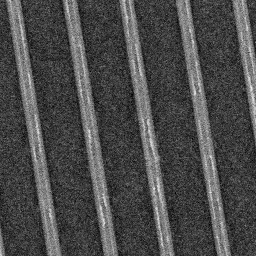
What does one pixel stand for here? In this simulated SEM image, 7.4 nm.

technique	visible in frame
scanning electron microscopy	parallel lines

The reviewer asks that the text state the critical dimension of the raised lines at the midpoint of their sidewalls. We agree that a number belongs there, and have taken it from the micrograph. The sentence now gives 70.3 nm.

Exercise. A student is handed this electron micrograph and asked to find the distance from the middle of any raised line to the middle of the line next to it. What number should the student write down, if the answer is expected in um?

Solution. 0.412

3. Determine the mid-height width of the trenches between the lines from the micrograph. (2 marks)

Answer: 342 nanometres